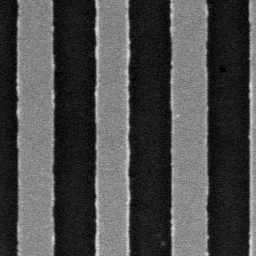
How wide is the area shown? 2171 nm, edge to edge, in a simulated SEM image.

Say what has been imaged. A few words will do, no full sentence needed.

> lines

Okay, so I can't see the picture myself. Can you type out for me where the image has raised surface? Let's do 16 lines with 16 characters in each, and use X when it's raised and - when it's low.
-XX---XX---XX---
-XX---XX---XX---
-XX---XX---XX---
-XX---XX---XX---
-XX---XX---XX---
-XX---XX---XX---
-XX---XX---XX---
-XX---XX---XX---
-XX---XX---XX---
-XX---XX---XX---
-XX---XX---XX---
-XX---XX---XX---
-XX---XX---XX---
-XX---XX---XX---
-XX---XX---XX---
-XX---XX---XX---